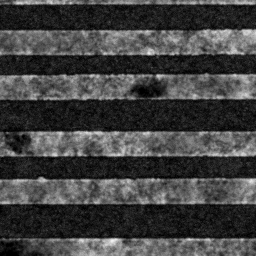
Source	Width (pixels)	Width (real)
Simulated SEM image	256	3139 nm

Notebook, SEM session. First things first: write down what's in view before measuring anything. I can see lines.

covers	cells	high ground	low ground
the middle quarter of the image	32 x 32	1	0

00000000000000000000000000000000
00000000000000000000000000000000
00000000000000000000000000000000
11111111111111111111111111111111
11111111111111111111111111111111
11111111111111111111111111111111
11111111111111111111111111111111
11111111111111111111111111111111
11111111111111111111111111111111
00000000000000000000000000000000
00000000000000000000000000000000
00000000000000000000000000000000
00000000000000000000000000000000
00000000000000000000000000000000
00000000000000000000000000000000
00000000000000000000000000000000
00000000000000000000000000000000
11111111111111111111111111111111
11111111111111111111111111111111
11111111111111111111111111111111
11111111111111111111111111111111
11111111111111111111111111111111
11111111111111111111111111111111
00000000000000000000000000000000
00000000000000000000000000000000
00000000000000000000000000000000
00000000000000000000000000000000
00000000000000000000000000000000
00000000000000000000000000000000
11111111111111111111111111111111
11111111111111111111111111111111
11111111111111111111111111111111